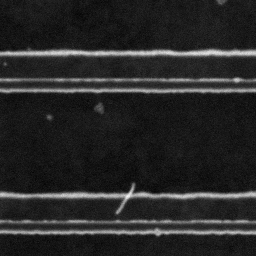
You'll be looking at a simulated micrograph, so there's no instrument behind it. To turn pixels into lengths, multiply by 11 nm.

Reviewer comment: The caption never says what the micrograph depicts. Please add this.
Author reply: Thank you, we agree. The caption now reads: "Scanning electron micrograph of lines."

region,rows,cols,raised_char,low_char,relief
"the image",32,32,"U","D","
DDDDDDDDDDDDDDDDDDDDDDDDDDDDDDDD
DDDDDDDDDDDDDDDDDDDDDDDDDDDDDDDD
DDDDDDDDDDDDDDDDDDDDDDDDDDDDDDDD
DDDDDDDDDDDDDDDDDDDDDDDDDDDDDDDD
DDDDDDDDDDDDDDDDDDDDDDDDDDDDDDDD
DDDDDDDDDDDDDDDDDDDDDDDDDDDDDDDD
DDDDDDDDDDDDDDDDDDDDDDDDDDDDDDDD
UUUUUUUUUUUUUUUUUUUUUUUUUUUUUUUU
UUUUUUUUUUUUUUUUUUUUUUUUUUUUUUUU
UUUUUUUUUUUUUUUUUUUUUUUUUUUUUUUU
UUUUUUUUUUUUUUUUUUUUUUUUUUUUUUUU
DDDDDDDDDDDDDDDDDDUUUDDDDDDDDDDD
DDDDDDDDDDDDDDDDDDDDDDDDDDDDDDDD
DDDDDDDDDDDDDDDDDDDDDDDDDDDDDDDD
DDDDDDDDDDDDDDDDDDDDDDDDDDDDDDDD
DDDDDDDDDDDDDDDDDDDDDDDDDDDDDDDD
DDDDDDDDDDDDDDDDDDDDDDDDDDDDDDDD
DDDDDDDDDDDDDDDDDDDDDDDDDDDDDDDD
DDDDDDDDDDDDDDDDDDDDDDDDDDDDDDDD
DDDDDDDDDDDDDDDDDDDDDDDDDDDDDDDD
DDDDDDDDDDDDDDDDDDDDDDDDDDDDDDDD
DDDDDDDDDDDDDDDDDDDDDDDDDDDDDDDD
DDDDDDDDDDDDDDDDDDDDDDDDDDDDDDDD
DDDDDDDDDDDDDDDDDDDDDDDDDDDDDDDD
DDDDDDDDDDDDDDDDUUUDDDDDDDDDDDDU
UUUUUUUUUUUUUUUUUUUUUUUUUUUUUUUU
UUUUUUUUUUUUUUUUUUUUUUUUUUUUUUUU
UUUUUUUUUUUUUUUUUUUUUUUUUUUUUUUU
UUUUUUUUUUUUUUUUUUUUUUUUUUUUUUUU
DDDDDDDDDDDDDDDDDDDDDDDDDDDDDDDD
DDDDDDDDDDDDDDDDDDDDDDDDDDDDDDDD
DDDDDDDDDDDDDDDDDDDDDDDDDDDDDDDD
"